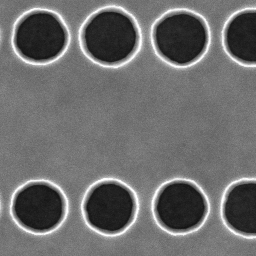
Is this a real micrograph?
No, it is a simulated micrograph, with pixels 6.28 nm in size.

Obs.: holes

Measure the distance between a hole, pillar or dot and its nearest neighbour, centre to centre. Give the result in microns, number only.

0.442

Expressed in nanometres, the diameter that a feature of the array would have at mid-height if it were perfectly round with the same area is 321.